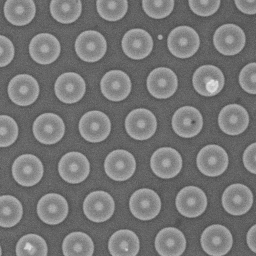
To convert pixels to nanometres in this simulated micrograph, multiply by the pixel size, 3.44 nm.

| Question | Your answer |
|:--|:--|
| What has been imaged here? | an array of small figures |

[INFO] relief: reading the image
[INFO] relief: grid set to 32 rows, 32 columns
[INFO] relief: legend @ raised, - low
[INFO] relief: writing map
-@@@--@@@@--@@@@--@@@@--@@@--@@@
-@@@--@@@@--@@@@--@@@---@@@---@@
-@@@---@@----@@-----------------
----------------------@@---@@@--
----@@@---@@@--@@@@--@@@@--@@@@-
@@--@@@--@@@@--@@@@--@@@@--@@@@-
@@--@@@---@@@---@@@--@@@---@@@--
@---@@@---@@--------------------
--------------------@----@@---@@
--@@----@@---@@@---@@@--@@@@--@@
-@@@@--@@@@--@@@--@@@@--@@@@--@@
-@@@@--@@@@--@@@---@@@---@@----@
-@@@----@@----@-----------------
-----------------------@----@@--
@----@@---@@@---@@@---@@@--@@@@-
@@--@@@@--@@@@--@@@@--@@@--@@@@-
@@--@@@@--@@@@--@@@---@@@---@@--
@@---@@----@@----@--------------
--------------------@----@@@---@
---@----@@@--@@@@--@@@@--@@@--@@
--@@@--@@@@--@@@@--@@@@--@@@--@@
--@@@--@@@@--@@@@--@@@---@@@---@
--@@@---@@----@@----------------
-----------------------@@---@@@-
@----@@@---@@@--@@@@--@@@@--@@@@
@@@--@@@--@@@@--@@@@--@@@@--@@@@
@@@--@@@---@@@--@@@@--@@@---@@@-
@@---@@@---@@-------------------
---------------------@----@@---@
---@@---@@@---@@@---@@@--@@@@--@
--@@@@--@@@@--@@@--@@@@--@@@@--@
--@@@@--@@@@--@@@---@@@---@@----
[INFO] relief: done